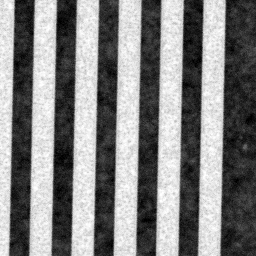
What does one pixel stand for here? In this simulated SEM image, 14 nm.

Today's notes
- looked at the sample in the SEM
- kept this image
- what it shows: parallel lines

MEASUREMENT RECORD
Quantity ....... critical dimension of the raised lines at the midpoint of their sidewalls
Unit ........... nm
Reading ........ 295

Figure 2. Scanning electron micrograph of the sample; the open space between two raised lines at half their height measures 295 nm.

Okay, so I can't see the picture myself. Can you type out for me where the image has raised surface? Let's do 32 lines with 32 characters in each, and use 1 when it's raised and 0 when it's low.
11001110001100011100111000110000
11001110001100011000111000110000
11001110001100011000111000110000
11001110001100011000111000110000
11001110001100011000111000110000
11001110001100011000111000110000
11001110001100011000111001110000
11001110001100011000111001110000
10001110001100011000111001110000
10001110001100011000111001110000
10001110001100011000111001110000
10001110001100011000111001110000
10001110001100011000111001110000
10001110001100011000111001110000
10001110011100011000110001110000
10001110011100011000110001110000
10001110011100011000110001110000
10001110011100011000110001110000
10001110011100011000110001110000
10001110011100011000110001110000
10001110011100011000110001110000
10001100011100011000110001110000
10001100011100011000110001110000
10001100011100011000110001110000
10001100011100011000110001110000
10001100011100011000110001110000
10001100011100011000110001110000
10001100011100111000110001100000
10001100011100111000110001100000
10001100011100111000110001100000
10001100011100111000110001100000
10001100011100111000110001100000